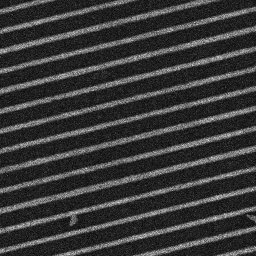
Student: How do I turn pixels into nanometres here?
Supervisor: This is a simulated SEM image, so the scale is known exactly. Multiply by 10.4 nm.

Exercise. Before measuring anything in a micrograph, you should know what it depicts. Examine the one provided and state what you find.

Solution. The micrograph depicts parallel lines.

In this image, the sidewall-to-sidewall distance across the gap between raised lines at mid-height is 152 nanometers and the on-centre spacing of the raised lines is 201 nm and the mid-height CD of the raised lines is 44.1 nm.